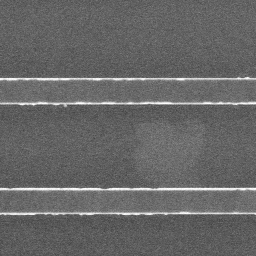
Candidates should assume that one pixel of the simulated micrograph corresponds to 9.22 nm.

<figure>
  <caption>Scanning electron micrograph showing lines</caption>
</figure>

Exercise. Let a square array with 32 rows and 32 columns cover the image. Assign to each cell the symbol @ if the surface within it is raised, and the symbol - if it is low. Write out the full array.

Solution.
--------------------------------
--------------------------------
--------------------------------
--------------------------------
--------------------------------
--------------------------------
--------------------------------
--------------------------------
--------------------------------
--------------------------------
@@@@@@@@@@@@@@@@@@@@@@@@@@@@@@@@
@@@@@@@@@@@@@@@@@@@@@@@@@@@@@@@@
@@@@@@@@@@@@@@@@@@@@@@@@@@@@@@@@
--------------------------------
--------------------------------
--------------------------------
--------------------------------
--------------------------------
--------------------------------
--------------------------------
--------------------------------
--------------------------------
--------------------------------
--------------------------------
@@@@@@@@@@@@@@@@@@@@@@@@@@@@@@@@
@@@@@@@@@@@@@@@@@@@@@@@@@@@@@@@@
@@@@@@@@@@@@@@@@@@@@@@@@@@@@@@@@
--------------------------------
--------------------------------
--------------------------------
--------------------------------
--------------------------------